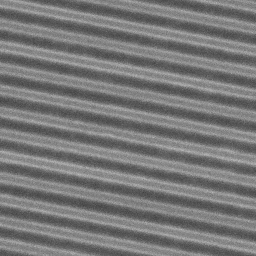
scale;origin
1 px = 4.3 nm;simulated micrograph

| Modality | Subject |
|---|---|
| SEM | parallel lines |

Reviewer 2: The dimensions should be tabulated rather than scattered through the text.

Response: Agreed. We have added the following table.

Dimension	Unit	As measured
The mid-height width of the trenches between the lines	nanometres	26.4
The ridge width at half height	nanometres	67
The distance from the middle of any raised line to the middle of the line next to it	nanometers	92.5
